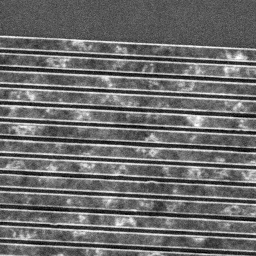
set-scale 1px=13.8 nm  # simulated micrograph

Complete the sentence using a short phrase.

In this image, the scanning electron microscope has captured parallel lines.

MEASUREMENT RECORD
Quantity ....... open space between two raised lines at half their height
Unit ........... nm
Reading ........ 63.9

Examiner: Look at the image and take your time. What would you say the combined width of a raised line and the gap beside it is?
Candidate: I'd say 239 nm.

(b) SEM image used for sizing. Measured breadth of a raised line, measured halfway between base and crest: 13 px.